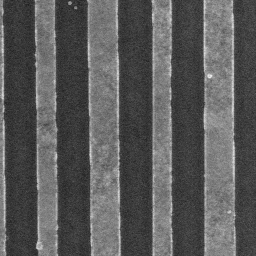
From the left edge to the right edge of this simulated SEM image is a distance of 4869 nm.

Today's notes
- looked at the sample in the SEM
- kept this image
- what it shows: lines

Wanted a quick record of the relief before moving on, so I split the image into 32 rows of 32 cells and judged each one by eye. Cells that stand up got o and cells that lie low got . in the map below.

....ooo....oooo....oo.....ooo...
....ooo....oooo....oo.....ooo...
....ooo....oooo....oo.....ooo...
....ooo....oooo....oo.....ooo...
....ooo....oooo....oo.....ooo...
....ooo....oooo....oo.....ooo...
.....oo....oooo....oo.....ooo...
.....oo....oooo....oo.....ooo...
....ooo....oooo....oo.....ooo...
.....oo....oooo....oo.....ooo...
.....oo....oooo....oo.....ooo...
.....oo....oooo....oo.....ooo...
.....oo....oooo....oo.....ooo...
.....oo....oooo....oo.....ooo...
.....oo....oooo....oo.....ooo...
.....oo....oooo....oo.....ooo...
.....oo....oooo....oo.....ooo...
.....oo....oooo....oo.....ooo...
.....oo....oooo....oo.....ooo...
.....oo....oooo....oo.....ooo...
.....oo....oooo....oo.....ooo...
.....oo....oooo....oo.....ooo...
o....oo....oooo....oo.....ooo...
o....oo....oooo....oo.....ooo...
o....oo....oooo....oo.....ooo...
o....oo....oooo....oo.....ooo...
o....oo....oooo....oo.....ooo...
o....oo....oooo....oo.....ooo...
o....oo....oooo....oo.....ooo...
o....oo....oooo....oo.....ooo...
o....oo....oooo....oo.....ooo...
o....oo.....ooo....oo.....ooo...